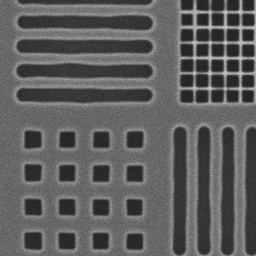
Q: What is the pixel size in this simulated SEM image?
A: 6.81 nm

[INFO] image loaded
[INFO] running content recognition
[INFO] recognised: groups of lines, slits or small figures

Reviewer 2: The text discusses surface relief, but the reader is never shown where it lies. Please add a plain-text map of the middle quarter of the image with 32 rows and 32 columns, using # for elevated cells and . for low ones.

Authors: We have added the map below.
.....................########...
......................#######...
......................########..
#.......######.......########...
#############################...
#############################...
.....................#########..
......................#######...
......................#######...
.....................#########..
################################
################################
################################
################################
################################
################################
############################...#
...####....#####....#######....#
...####.....####....#######....#
...####.....####....#######....#
...####.....####....#######....#
###########################....#
###########################....#
###########################....#
###########################....#
...#####...#####...########....#
...####.....####....#######....#
...####.....####....#######....#
...####.....####....#######....#
########...#####...########....#
###########################....#
###########################....#